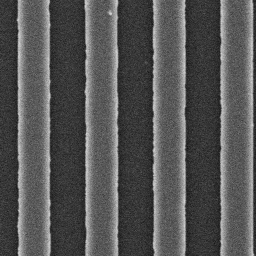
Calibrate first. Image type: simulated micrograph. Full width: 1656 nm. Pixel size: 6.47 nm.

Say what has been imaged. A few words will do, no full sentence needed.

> lines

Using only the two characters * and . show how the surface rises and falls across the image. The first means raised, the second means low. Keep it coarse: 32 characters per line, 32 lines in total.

..****.....****....****.....****
..****.....****....****.....****
..****.....****....****.....****
..****.....****....****.....****
..****.....****....****.....****
..****.....****....****.....****
..****.....****....****.....****
..****.....****....****.....****
..****.....****....****.....****
..****.....****....****.....****
..****.....****....****.....****
..****.....****....****.....****
..****.....****....****.....****
..****.....****....****.....****
..****.....****....****.....****
..****.....****....****.....****
..****.....****....****.....****
..****.....****....****.....****
..****.....****....****.....****
..****.....****....****.....****
..****.....****....****.....****
..****.....****....****.....****
..****.....****....****.....****
..****.....****....****.....****
..****.....****....****.....****
..****.....****....****.....****
..****.....****....****.....****
..****.....****....****.....****
..****.....****....****.....****
..****.....****....****.....****
..****.....****....****.....****
..****.....****....****.....****